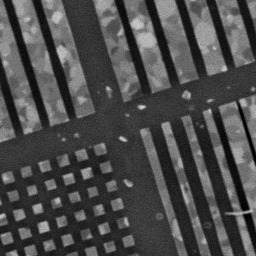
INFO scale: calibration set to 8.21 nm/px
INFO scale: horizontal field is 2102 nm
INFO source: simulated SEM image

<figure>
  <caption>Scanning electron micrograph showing groups of lines, slits or small figures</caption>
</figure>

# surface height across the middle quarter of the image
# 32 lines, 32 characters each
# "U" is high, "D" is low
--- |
UUUUDDDDDDDDUUUUUDDDUUUUUDDDUUUU
UUUUDDDDDDDDDUUUUUDDUUUUUDDDUUUU
UUUUUDDDDDDDDUUUUUDDDUUUUUDDUUUU
UUUUUDDDDDDDDUUUUUDDDUUUUUDDDUUU
DUUUUDDDDDDDDDUUUUUDDUUUUUDDDUDD
DUUUUUDDDDDDDDUUUUUDDUUUUUUDDDDD
DUUUUUDDDDDDDDUUUUUDDDUUDDDDDDDD
DDUUUUDDDDDDDDDUUUUUDDDDDDDDDDDD
DDUUUUUDDDDDDDDUUUDDDDDDDDDDDDDD
DDUUUUUDDDDDDDDDDDDDDDDDDDDDDDDD
DDDUUUUDDDDDDDDDDDDDDDDDDDDDDDDD
DDDUUUUUDDDDDDDDDDDDDDDDDDDDDDDD
UDDUUUUDDDDDDDDDDDDDDDDDDDDDDDDD
UDDDDDDDDDDDDDDDDDDDDDDDDDDDDDUU
DDDDDDDDDDDDDDDDDDDDDDDDDDDDDDUU
DDDDDDDDDDDDDDDDDDDDDDDDDUUDDDUU
DDDDDDDDDDDDDDDDDDDUUDDDDUUDDDDU
DDDDDDDDDDDDDDDDDDDUUUDDDUUDDDDU
DDDDDDDDDDDDDDDDDDDDUUDDDUUDDDDU
DDDDDDDDDDDDDDDDDDDDUUDDDDUUDDDU
DDDDDDDDUUDDDDDDDDDDUUUDDDUUDDDD
DDDDUDDDUUUDDDDDDDDDDUUDDDUUUDDD
DDDUUUDDUUDDDDDDDDDDDUUDDDUUUDDD
UDDUUUDDDDDDDDDDDDDDDUUDDDDUUDDD
UDDDDDDDDDDDDDDDDDDDDUUUDDDUUDDD
DDDDDDDDDUUUDDDDDDDDDDUUDDDUUUDD
DDDDDUUDDUUUDDDDDDDDDDUUDDDDUUDD
DUDDDUUDDDDDDDDDDDDDDDDUUDDDUUDD
UUDDDUDDDDDDDDDDDDDDDDDUUDDDUUUD
UUDDDDDDDDDUUDDDDDDDDDDUUDDDDUUD
DDDDDDDDDDDUUDDDDDDDDDDUUDDDDUUD
DDDDDDUUDDDUUDDDDDDDDDDDUUDDDUUD